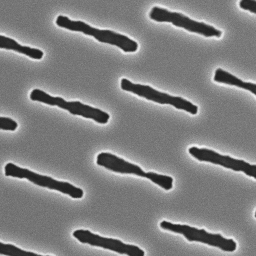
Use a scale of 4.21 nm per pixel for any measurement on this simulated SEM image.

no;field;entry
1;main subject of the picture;holes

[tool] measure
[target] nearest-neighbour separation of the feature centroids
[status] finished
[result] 328 nm